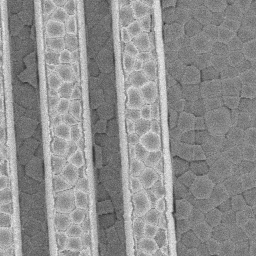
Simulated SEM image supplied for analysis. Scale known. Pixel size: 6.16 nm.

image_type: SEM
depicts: one or a few lines or trenches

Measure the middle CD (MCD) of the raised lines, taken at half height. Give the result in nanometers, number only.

272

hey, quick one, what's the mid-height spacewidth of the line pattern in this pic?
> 203 nm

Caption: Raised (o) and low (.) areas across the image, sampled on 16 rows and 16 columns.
..ooo..ooo......
..ooo..ooo......
..ooo..ooo......
...oo..ooo......
...oo..ooo......
o..oo..ooo......
o..oo...oo......
o..oo...oo......
o..ooo..oo......
o..ooo..oo......
o..ooo..ooo.....
o..ooo..ooo.....
o..ooo..ooo.....
o..ooo..ooo.....
o..ooo..ooo.....
o..ooo..ooo.....